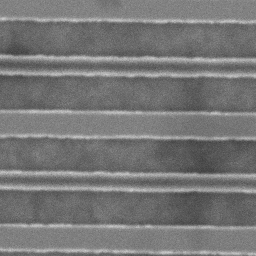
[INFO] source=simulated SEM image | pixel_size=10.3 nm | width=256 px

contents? lines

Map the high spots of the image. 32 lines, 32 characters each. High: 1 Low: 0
11111111111111111111111111111111
11111111111111111111111111111111
00000000010001111111111111111111
00000000000000000000000000000000
00000000000000000000000000000000
00000000000000000000000000000000
00000000000000000000000000000000
11111111111111111111111111111111
11111111111111111111111111111111
00000000000000001011011111111111
00000000000000000000000000000000
00000000000000000000000000000000
00000000000000000000000000000000
00000000000000000000000000000000
11111111111111111111111111111111
11111111111111111111111111111111
11111111111111111111111111111111
00000000000000000000000000000000
00000000000000000000000000000000
00000000000000000000000000000000
00000000000000000000000000000000
11100001000000000000000000000000
11111111111111111111111111111111
11111111111111111111111111111111
00000000000000000000000000000000
00000000000000000000000000000000
00000000000000000000000000000000
00000000000000000000000000000000
11111111111111111111111111111111
11111111111111111111111111111111
11111111111111111111111111111111
00000000000000101111111111111111